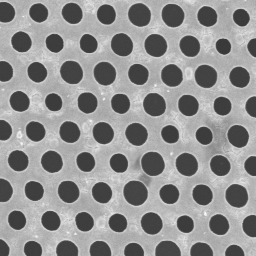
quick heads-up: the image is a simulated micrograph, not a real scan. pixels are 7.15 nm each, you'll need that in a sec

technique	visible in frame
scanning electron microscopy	a regular array of holes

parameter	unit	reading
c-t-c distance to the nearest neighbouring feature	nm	240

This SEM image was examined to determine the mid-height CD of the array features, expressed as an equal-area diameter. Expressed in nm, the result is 147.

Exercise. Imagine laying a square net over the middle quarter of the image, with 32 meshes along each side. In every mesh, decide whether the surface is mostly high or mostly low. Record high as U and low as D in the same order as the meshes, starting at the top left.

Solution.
DDDDUUUUDDDDUUUUUDDDUUUUUDDDUUUU
DDDDDUUDDDDDDUUUDDDDDUUUDDDDDUUU
DDDDDUUDDDDDDUUUDDDDDUUUDDDDDDUU
DDDDDUUUDDDDDUUUDDDDDUUUDDDDDDUU
UDDDUUUUDDDDUUUUUDDDDUUUUDDDDUUU
UUUUUUUUUUDUUUUUUUUUUUUUUUDDUUUU
UUUUUUUUUUUUUUUUUUUUUUUUUUUUUUUU
UUUUDDDUUUUUUDDUUUUUUDDDUUUUUUUU
UUUUDDDDUUUUDDDDUUUUDDDDDUUUUDDD
UUUDDDDDUUUUDDDDUUUUDDDDDUUUUDDD
UUUUDDDDUUUUDDDDUUUUDDDDDUUUUDDD
UUUUDDDDUUUUDDDDUUUUDDDDDUUUUDDD
UUUUUUUUUUUUUUDUUUUUUDDDDUUUUUDD
UUUUUUUUUUUUUUUUUUUUUUUUUUUUUUUU
DDUUUUUUUDUUUUUUUUUUUUUUUUUUUUUU
DDDUUUUUDDDDUUUUDDDDUUUUUUDUUUUU
DDDDUUUDDDDDUUUDDDDDDUUUDDDDUUUU
DDDDUUUDDDDDDUUDDDDDDUUUDDDDDUUU
DDDDUUUUDDDDUUUUDDDDDUUUUDDDDUUU
DDDUUUUUDDDDUUUUDDDDUUUUUUDDUUUU
UUUUUUUUUUUUUUUUUUUUUUUUUUUUUUUU
UUUUUUUUUUUUUUUUUUUUUUUUUUUUUUUU
UUUUDDDUUUUUUDUUUUUUDDDDUUUUUUDU
UUUDDDDUUUUUDDDUUUUDDDDDDUUUDDDD
UUUDDDDDUUUDDDDDUUUDDDDDDUUUDDDD
UUUDDDDDUUUUDDDDUUUDDDDDDUUUDDDD
UUUUDDDUUUUUDDDDUUUUDDDDDUUUDDDD
UUUUUUUUUUUUUUUUUUUUUDDDUUUUUDDD
UUUUUUUUUUUUUUUUUUUUUUUUUUUUUUUU
DDUUUUUUUDUUUUUUDDDUUUUUUUUUUUUU
DDDUUUUDDDDUUUUDDDDDUUUUUDDDUUUU
DDDDUUUDDDDDUUUDDDDDDUUUDDDDDUUU